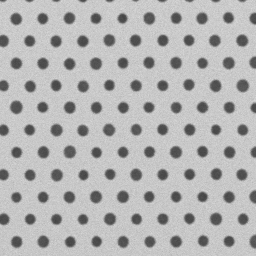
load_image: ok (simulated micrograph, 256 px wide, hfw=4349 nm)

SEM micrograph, a regular array of holes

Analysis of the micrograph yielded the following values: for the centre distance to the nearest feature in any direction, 434 nm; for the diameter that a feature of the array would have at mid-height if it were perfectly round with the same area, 194 nm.